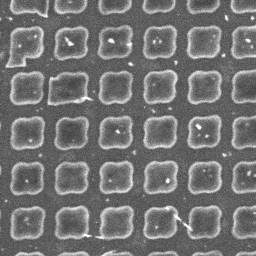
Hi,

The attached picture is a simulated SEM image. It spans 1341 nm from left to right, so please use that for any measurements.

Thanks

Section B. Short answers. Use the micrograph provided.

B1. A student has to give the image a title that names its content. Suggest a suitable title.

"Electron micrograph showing a regular array of raised bodies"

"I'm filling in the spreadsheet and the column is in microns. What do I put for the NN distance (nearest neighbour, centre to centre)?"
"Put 0.231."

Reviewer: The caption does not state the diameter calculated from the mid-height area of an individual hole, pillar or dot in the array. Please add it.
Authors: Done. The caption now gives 171 nanometers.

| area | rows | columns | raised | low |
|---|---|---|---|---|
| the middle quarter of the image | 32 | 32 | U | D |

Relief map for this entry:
DDDDDDDDDDDDDDDDDDDDDDDDDDDDDDDD
DDDDDDDDDDDDDDDDDDDDDDDDDDDDDDDD
DDDDUDDDDDDUDUUUDDDDDUUUUUUUDDDD
UUUUUUDDDUUUUUUUUDDDDUUUUUUUDDDD
UUUUUUDDDUUUUUUUUDDDUUUUUUUUDDDU
UUUUUUDDDUUUUUUUDDDDDUUUUUUUDDDD
UUUUUDDDDUUUUUUUDDDDDUUUUUUUDDDD
UUUUUDDDDUUUUUUUUDDDUUUUUUUUDDDU
UUUUUUDDDUUUUUUUDDDDUUUUUUUDDDDU
DDDDDDDDDDUUDDDDDDDDDUUDDDDDDDDD
DDDDDDDDDDDDDDDDDDDDDDDDDDDDDDDD
DDDDDDDDDDDDDDDDDDDDDDDDDDDDDDDD
DDDDDDDDDDDDDDDDDDDDDDDDDDDDDDDD
DDDDDDDDDDDDDDDUDDDDDDDDDUUDDDDD
UUUUUUDDDDUUUUUUUDDDDUUUUUUUDDDD
UUUUUUDDDUUUUUUUUDDDUUUUUUUUDDDU
UUUUUUDDDUUUUUUUDDDDUUUUUUUUDDDU
UUUUUDDDDUUUUUUUUDDDDUUUUUUUDDDD
UUUUUUDDDUUUUUUUUDDDUUUUUUUUDDDU
UUUUUDDDDUUUUUUUUDDDUUUUUUUUDDDU
UUUUUDDDDUUUUUUUDDDDDUUUDUDDDDDD
DDDDDDDDDDDDDDDDDDDDDDDDDDDDDDDD
DDDDDDDDDDDDDDDDDDDDDDDDDDDDDDDD
DDDDDDDDDDDDDDDDDDDDDDDDDDDDDDDD
DDDDDDDDDDDDDDDDDDDDDDDDDDDDDDDD
UUUUUDDDDDUUUUUUUDDDDUUUUUUUDDDD
UUUUUUDDDUUUUUUUUDDDUUUUUUUUDDDD
UUUUUDDDDUUUUUUUUDDDUUUUUUUUDDDD
UUUUUDDDDDUUUUUUUDDDDUUUUUUUDDDD
UUUUUUDDDUUUUUUUUDDDDUUUUUUUDDDU
UUUUUUDDDUUUUUUUUDDDUUUUUUUUDDDU
UUUUUDDDDUUUUUUUDDDDDUUUUUUDDDDD